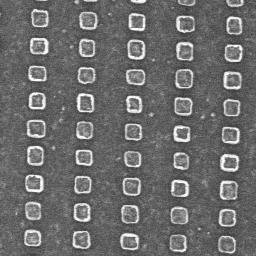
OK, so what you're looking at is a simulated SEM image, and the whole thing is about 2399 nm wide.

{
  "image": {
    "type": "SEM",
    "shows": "a regular array of raised bodies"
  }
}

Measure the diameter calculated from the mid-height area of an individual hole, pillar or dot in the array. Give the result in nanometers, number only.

164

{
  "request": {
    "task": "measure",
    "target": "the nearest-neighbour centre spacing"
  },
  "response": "256 nanometers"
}